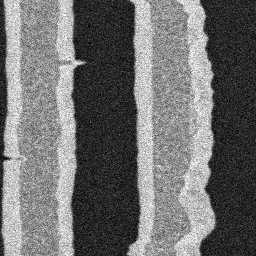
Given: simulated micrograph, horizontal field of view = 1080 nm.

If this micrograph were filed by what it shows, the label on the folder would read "one or a few lines or trenches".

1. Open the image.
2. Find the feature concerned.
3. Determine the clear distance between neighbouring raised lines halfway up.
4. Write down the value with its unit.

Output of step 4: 318 nm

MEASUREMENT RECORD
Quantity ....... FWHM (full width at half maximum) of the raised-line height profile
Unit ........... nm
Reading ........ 245